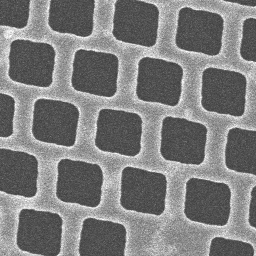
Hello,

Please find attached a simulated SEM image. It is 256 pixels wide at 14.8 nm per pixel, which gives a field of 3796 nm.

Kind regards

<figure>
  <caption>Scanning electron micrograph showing a regular array of holes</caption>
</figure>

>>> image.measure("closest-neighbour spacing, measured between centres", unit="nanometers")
946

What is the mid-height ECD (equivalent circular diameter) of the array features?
0.733 µm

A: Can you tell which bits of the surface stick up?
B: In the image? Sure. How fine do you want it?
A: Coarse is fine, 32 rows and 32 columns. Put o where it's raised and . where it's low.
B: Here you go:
....oo......oo.....ooooooooooo..
....oo......oo......oo....oooooo
....oo......oo......oo......ooo.
oo.ooo......oo......oo......oo..
oooooooooo.ooo......oo......oo..
o.....ooooooooooo..ooo......oo..
o......ooo...ooooooooooo...ooo..
o......oo......ooo...oooooooooo.
o......oo......oo......ooo.ooooo
o......oo......oo......oo......o
ooo...ooo......oo......oo......o
oooooooooo.....oo......oo......o
..ooo..ooooooooooo....ooo......o
..oo......ooooooooooooooo......o
..oo......oo.....oooooooooooo.oo
..oo......oo......oo.....ooooooo
..oo......oo......oo......ooo...
ooooo....ooo......oo......oo....
oooooooooooo......oo......oo....
....oooooooooooo.ooo......oo....
.....oo.....ooooooooooo..ooo....
.....oo......oo....ooooooooooo..
.....oo......oo......ooo..oooooo
.....oo......oo......oo......ooo
ooo.ooo......oo......oo......oo.
oooooooooo..ooo......oo......oo.
ooo....oooooooooo...ooo......oo.
oo......ooo..ooooooooooo.....oo.
oo......oo......oooooooooooooooo
oo......oo......oooooooooooooooo
oo......oo......oooooooooo.....o
ooo....ooo......oooooooooo......